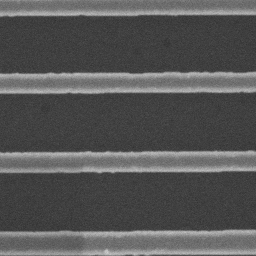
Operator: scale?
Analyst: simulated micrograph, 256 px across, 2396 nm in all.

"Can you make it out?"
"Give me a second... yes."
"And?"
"lines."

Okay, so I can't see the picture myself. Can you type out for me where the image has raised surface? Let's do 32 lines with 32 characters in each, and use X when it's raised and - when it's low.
XXXXXXXXXXXXXXXXXXXXXXXXXXXXXXXX
XXXXXXXXXXXXXXXXXXXXXXXXXXXXXXXX
--------------------------------
--------------------------------
--------------------------------
--------------------------------
--------------------------------
--------------------------------
--------------------------------
XXXXXXXXXXXXXXXXXXXXXXXXXXXXXXXX
XXXXXXXXXXXXXXXXXXXXXXXXXXXXXXXX
XXXXXXXXXXXXXXX-X--X------------
--------------------------------
--------------------------------
--------------------------------
--------------------------------
--------------------------------
--------------------------------
--------------------------------
XXXXXXXXXXXXXXXXXXXXXXXXXXXXXXXX
XXXXXXXXXXXXXXXXXXXXXXXXXXXXXXXX
---X----------------------------
--------------------------------
--------------------------------
--------------------------------
--------------------------------
--------------------------------
--------------------------------
--------------------------------
XXXXXXXXXXXXXXXXXXXXXXXXXXXXXXXX
XXXXXXXXXXXXXXXXXXXXXXXXXXXXXXXX
XXXXXXXXXXXXXXXXXXXXXXXXXXXXXXXX